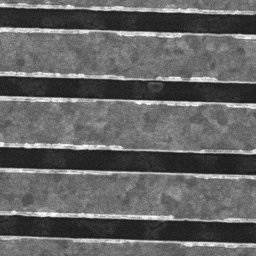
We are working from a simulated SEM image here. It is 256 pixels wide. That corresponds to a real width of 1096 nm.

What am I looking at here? one or a few lines or trenches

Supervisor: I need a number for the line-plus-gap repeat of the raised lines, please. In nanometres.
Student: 299